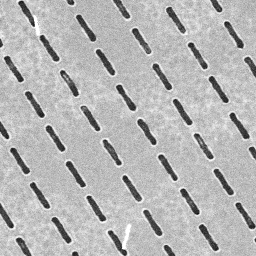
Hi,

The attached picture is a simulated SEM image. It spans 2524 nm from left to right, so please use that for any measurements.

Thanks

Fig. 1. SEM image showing a regular array of holes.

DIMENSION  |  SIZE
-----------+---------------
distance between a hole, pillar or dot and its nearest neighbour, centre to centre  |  395 nm